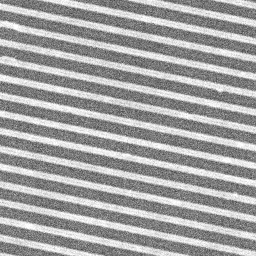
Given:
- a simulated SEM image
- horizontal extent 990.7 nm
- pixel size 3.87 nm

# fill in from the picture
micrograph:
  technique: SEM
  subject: parallel lines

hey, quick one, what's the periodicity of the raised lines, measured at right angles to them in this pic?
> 67.4 nanometers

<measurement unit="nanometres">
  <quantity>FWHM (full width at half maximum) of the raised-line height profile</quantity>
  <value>19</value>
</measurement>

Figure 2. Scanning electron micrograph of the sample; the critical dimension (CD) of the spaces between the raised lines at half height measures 47.3 nanometres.